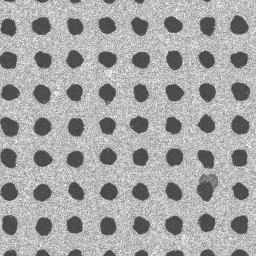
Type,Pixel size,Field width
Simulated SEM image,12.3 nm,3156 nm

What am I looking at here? a regular array of holes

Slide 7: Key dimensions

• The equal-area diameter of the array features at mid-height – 214 nm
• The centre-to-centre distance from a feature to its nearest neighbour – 395 nm